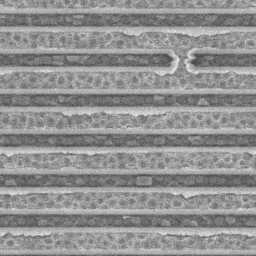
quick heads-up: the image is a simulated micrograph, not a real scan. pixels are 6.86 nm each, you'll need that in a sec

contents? parallel lines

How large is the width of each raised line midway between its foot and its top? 151 nm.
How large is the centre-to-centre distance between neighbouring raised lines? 275 nm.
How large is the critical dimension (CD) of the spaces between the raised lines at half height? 122 nm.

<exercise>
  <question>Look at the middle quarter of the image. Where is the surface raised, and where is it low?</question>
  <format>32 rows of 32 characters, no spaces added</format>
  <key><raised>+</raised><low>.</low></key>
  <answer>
...........................+++++
++++++++++++++++++++++++++++++++
++++++++++++++++++++++++++++++++
++++++++++++++++++++++++++++++++
++++++++++++++++++++++++++++++++
++++++++++++++++++++++++++++++++
++++++++++++++++++++++++++++++++
................................
................................
................................
................................
++++++++++++++++++++............
++++++++++++++++++++++++++++++++
++++++++++++++++++++++++++++++++
++++++++++++++++++++++++++++++++
++++++++++++++++++++++++++++++++
++++++++++++++++++++++++++++++++
................................
................................
................................
................................
++++++++++++++++++++++++++++++++
++++++++++++++++++++++++++++++++
++++++++++++++++++++++++++++++++
++++++++++++++++++++++++++++++++
++++++++++++++++++++++++++++++++
++++++++++++++++++++++++++++++++
................................
................................
................................
................................
................................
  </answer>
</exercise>